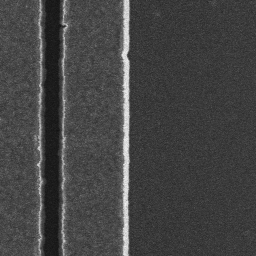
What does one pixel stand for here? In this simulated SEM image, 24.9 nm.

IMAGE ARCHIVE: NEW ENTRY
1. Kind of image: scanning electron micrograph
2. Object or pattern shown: one or a few lines or trenches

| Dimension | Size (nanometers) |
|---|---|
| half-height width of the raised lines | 1600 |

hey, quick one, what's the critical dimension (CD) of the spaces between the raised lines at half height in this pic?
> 485 nm